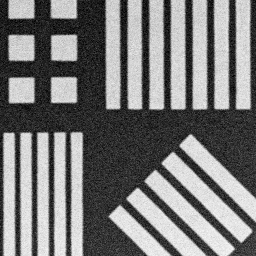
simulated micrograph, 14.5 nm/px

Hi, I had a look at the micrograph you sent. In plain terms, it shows groups of lines, slits or small figures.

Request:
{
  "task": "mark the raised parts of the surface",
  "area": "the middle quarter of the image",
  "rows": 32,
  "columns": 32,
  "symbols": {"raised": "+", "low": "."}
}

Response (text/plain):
...........+++..+++...+++..+++..
...........+++..+++...+++..+++..
...........+++..+++...+++..+++..
++.........+++..+++...+++..+++..
+++........+++..+++...+++..+++..
+++........+++..+++...+++..+++..
+++........+++..+++...+++..+++..
+++........+++..+++...+++..+++..
+++........+++..+++...+++..+++..
+++........+++..+++...+++..+++..
...........+++..+++...+++..+++..
................................
................................
................................
................................
................................
................................
..++............................
..++...........................+
..++..........................++
..++.........................+++
..++..........................++
..++.......................+...+
..++......................+++...
..++.....................+++++..
..++.....................++++++.
..++......................++++++
..++..................++...+++++
..++.................++++...++++
..++................++++++...+++
..++.................++++++...++
..++..............+...++++++...+